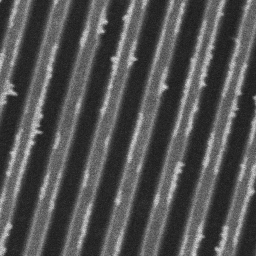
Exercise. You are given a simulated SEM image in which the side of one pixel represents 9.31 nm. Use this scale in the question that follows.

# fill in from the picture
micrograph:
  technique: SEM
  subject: parallel lines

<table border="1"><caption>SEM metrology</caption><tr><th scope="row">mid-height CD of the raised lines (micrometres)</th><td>0.172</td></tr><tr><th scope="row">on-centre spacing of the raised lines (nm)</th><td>348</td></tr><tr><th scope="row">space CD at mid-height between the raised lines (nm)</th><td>173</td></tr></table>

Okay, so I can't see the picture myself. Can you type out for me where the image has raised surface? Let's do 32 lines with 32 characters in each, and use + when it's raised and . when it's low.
..++...++..+++..++...++...++...+
.+++..++...++...++...++...++..++
.++...++...++..+++..+++..+++..++
.++...++..+++..+++..+++..++...++
.++..+++..+++..++...++...++..+++
+++..++...++...++...++..+++..+++
++...++...++..+++..+++..+++..++.
++...++..+++..+++..++...++...++.
++..+++..++...++...++...++...++.
++..++...++...++...++..+++..+++.
+...++...++..+++..+++..+++..++..
++.+++..+++..++...++...++...++..
+..+++..++...++...++...++..+++..
...++...++...++..+++..+++..+++..
...++..+++..+++..+++..++...++...
..+++..+++..++...++...++...++..+
..+++..++...++...++..+++..+++..+
..++...++..+++..+++..+++..++...+
..++..+++..+++..+++..++...++...+
.+++..+++..++...++...++...++..++
.++...++...++...++..+++..+++..++
.++...++..+++..+++..+++..++...++
.++..+++..+++..++...++...++...++
+++..++...++...++...++...++..+++
++...++...++...++..+++..++...++.
++...++..+++..+++..++...++...++.
++..+++..++...++...++...++...++.
+...++...++...++...++..+++..+++.
+...++...++..+++..+++..+++..++..
+..+++..+++..+++..++...++...++..
+..++...++...++...++...++..+++..
+..++...++...++..+++..+++..+++..